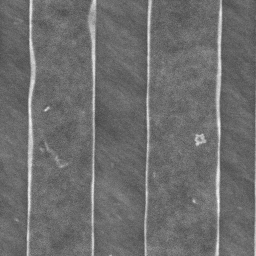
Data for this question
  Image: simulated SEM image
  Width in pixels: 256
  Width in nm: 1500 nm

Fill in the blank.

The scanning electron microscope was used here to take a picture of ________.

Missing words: groups of lines, slits or small figures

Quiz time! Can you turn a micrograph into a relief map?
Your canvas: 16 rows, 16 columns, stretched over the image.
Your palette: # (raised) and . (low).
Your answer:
..####...#####..
..####...#####..
..####...#####..
..####...#####..
..####...#####..
..####...#####..
..####...#####..
..####...#####..
..####...#####..
..####...#####..
..####...#####..
..####...#####..
..####...#####..
..####...#####..
..####...#####..
..####...#####..